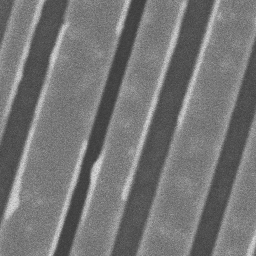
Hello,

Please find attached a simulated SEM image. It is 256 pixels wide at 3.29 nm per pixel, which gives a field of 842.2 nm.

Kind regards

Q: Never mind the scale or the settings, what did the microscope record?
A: one or a few lines or trenches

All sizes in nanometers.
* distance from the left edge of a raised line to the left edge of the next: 221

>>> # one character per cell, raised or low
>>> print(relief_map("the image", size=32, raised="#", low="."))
..###...########..#####....#####
.####...########..#####...######
.####...########.######...######
.###....#######..#####....######
####...########..#####...#######
####...########..#####...#######
####..########..######...######.
###...########..#####...#######.
###...########..#####...#######.
###...########.######...#######.
##...########..#####....######..
##...########..#####...#######..
##...########.######...#######..
#...########..#####....######...
#...########..#####...#######...
#...########..#####...#######..#
...########..######...######...#
...########..#####...#######...#
...########..#####...#######...#
...#######..######...#######..##
..########..#####...#######...##
..########.######...#######...##
..########.######...#######..###
.########..#####....######...###
.########..#####...#######...###
.########..#####...#######..####
.#######..#####....######...####
########..#####...#######...####
########..#####...#######..#####
#######..######...######...#####
#######..#####...#######...#####
#######..#####...#######...#####